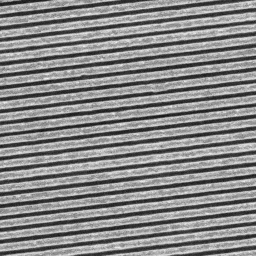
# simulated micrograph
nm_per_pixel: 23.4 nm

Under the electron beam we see parallel lines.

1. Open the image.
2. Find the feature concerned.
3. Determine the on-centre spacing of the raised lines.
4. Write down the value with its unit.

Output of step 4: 276 nm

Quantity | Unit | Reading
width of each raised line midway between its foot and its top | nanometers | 160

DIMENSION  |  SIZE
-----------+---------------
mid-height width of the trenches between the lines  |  122 nm